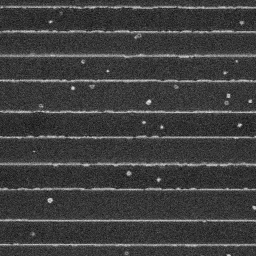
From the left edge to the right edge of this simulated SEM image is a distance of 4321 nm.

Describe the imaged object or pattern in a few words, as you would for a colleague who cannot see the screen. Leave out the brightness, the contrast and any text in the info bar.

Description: lines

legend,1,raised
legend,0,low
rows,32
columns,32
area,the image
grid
11111111111111111111111111111111
00000000000000000000000000000000
00000000000000000000000000000000
00000000000000000000000000000000
11111111111111111111111111111111
11111111111111111111111111111111
11111111111111111111111111111111
00000000000000000000000000000000
00000000000000000000000000000000
00000000000000000000000000000000
11111111111111111111111111111111
11111111111111111111111111111111
11111111111111111111111111111111
11111111111111111111111111111111
00000000000000000000000000000000
00000000000000000000000000000000
00000000000000000000000000000000
11111111111111111111111111111111
11111111111111111111111111111111
11111111111111111111111111111111
11111111111111111111111111111111
00000000000000000000000000000000
00000000000000000000000000000000
00000000000000000000000000000000
11111111111111111111111111111111
11111111111111111111111111111111
11111111111111111111111111111111
11111111111111111111111111111111
00000000000000000000000000000000
00000000000000000000000000000000
00000000000000000000000000000000
11111111111111111111111111111111